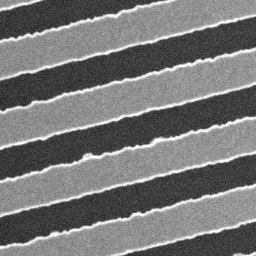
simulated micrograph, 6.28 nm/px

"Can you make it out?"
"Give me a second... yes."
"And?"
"lines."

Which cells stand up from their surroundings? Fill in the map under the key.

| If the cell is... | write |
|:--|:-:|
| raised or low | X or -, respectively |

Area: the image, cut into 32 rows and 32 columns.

XXX----------------XXXXXXXXXXXXX
---------------XXXXXXXXXXXXXXXXX
-----------XXXXXXXXXXXXXXXXXXX--
-------XXXXXXXXXXXXXXXXXXX------
---XXXXXXXXXXXXXXXXXXX----------
XXXXXXXXXXXXXXXXXX--------------
XXXXXXXXXXXXXX----------------XX
XXXXXXXXXX---------------XXXXXXX
XXXXXX---------------XXXXXXXXXXX
XX----------------XXXXXXXXXXXXXX
--------------XXXXXXXXXXXXXXXXXX
---------XXXXXXXXXXXXXXXXXXX----
------XXXXXXXXXXXXXXXXXXX-------
--XXXXXXXXXXXXXXXXXXX-----------
XXXXXXXXXXXXXXXXX---------------
XXXXXXXXXXXXX---------------XXXX
XXXXXXXX----------------XXXXXXXX
XXXXX---------------XXXXXXXXXXXX
X---------------XXXXXXXXXXXXXXXX
------------XXXXXXXXXXXXXXXXXX--
---------XXXXXXXXXXXXXXXXX------
-----XXXXXXXXXXXXXXXXX----------
-XXXXXXXXXXXXXXXXXX-------------
XXXXXXXXXXXXXX----------------XX
XXXXXXXXXX----------------XXXXXX
XXXXXX----------------XXXXXXXXXX
XX-----------------XXXXXXXXXXXXX
--------------XXXXXXXXXXXXXXXXXX
----------XXXXXXXXXXXXXXXXXXX---
------XXXXXXXXXXXXXXXXXXX-------
---XXXXXXXXXXXXXXXXXX-----------
XXXXXXXXXXXXXXXX----------------